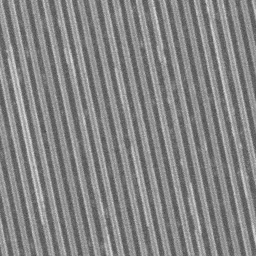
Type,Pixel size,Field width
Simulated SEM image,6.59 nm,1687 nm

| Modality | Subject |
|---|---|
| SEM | parallel lines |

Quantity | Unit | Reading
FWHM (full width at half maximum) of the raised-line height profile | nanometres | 33.9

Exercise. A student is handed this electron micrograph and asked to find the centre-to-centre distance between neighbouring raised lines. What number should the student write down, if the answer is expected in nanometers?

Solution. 75.1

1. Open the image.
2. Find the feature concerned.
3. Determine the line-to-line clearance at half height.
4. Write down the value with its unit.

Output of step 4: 0.0452 µm